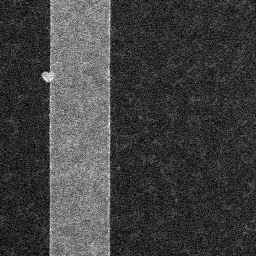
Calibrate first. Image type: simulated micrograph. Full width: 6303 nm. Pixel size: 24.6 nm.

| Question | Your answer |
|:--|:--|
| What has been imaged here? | one or a few lines or trenches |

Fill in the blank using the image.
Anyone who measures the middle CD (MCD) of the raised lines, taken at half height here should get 1460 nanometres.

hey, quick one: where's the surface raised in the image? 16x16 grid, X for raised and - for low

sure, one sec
---XXXX---------
---XXXX---------
---XXXX---------
---XXXX---------
---XXXX---------
---XXXX---------
---XXXX---------
---XXXX---------
---XXXX---------
---XXXX---------
---XXXX---------
---XXXX---------
---XXXX---------
---XXXX---------
---XXXX---------
---XXXX---------